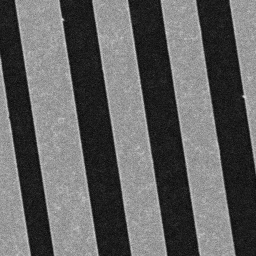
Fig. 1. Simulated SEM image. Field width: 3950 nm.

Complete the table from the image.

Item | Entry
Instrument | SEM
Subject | one or a few lines or trenches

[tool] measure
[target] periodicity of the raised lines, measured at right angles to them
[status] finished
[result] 1.08 microns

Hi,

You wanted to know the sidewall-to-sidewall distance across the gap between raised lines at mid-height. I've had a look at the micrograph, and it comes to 513 nanometers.